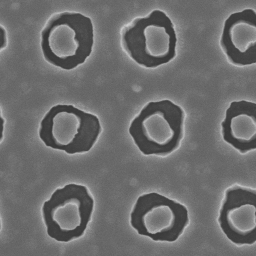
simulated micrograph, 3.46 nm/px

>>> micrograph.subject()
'ring-shaped grooves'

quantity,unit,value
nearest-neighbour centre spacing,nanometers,281